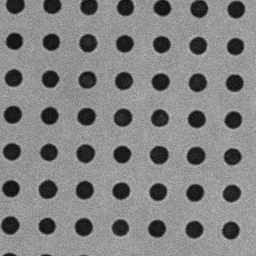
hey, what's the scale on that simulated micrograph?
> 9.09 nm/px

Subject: a regular array of holes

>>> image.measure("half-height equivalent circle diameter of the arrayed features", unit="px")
18.6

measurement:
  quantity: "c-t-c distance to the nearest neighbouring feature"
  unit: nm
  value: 332